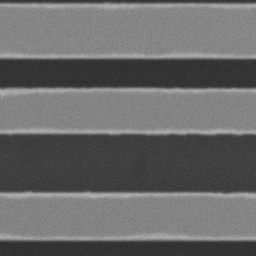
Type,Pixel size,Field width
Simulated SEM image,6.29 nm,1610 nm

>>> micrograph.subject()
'lines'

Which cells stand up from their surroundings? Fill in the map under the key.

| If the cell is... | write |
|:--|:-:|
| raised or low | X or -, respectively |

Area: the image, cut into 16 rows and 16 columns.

XXXXXXXXXXXXXXXX
XXXXXXXXXXXXXXXX
XXXXXXXXXXXXXXXX
XXXXXXXXXXXXXXXX
----------------
----------------
XXXXXXXXXXXXXXXX
XXXXXXXXXXXXXXXX
----------------
----------------
----------------
----------------
XXXXXXXXXXXXXXXX
XXXXXXXXXXXXXXXX
XXXXXXXXXXXXXXXX
----------------